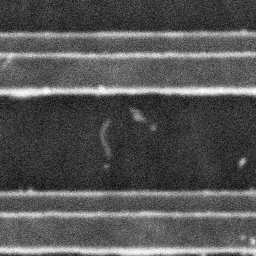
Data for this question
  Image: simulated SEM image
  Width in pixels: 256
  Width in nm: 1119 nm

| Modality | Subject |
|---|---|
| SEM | lines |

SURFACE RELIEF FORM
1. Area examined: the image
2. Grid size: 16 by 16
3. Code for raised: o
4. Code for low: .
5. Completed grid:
................
................
oooooooooooooooo
oooooooooooooooo
oooooooooooooooo
oooooooooooooooo
................
................
................
................
................
................
oooooooooooooooo
oooooooooooooooo
oooooooooooooooo
oooooooooooooooo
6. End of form